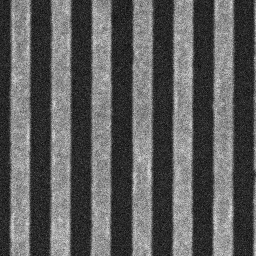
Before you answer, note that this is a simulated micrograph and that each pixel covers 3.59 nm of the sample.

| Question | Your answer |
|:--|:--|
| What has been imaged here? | parallel lines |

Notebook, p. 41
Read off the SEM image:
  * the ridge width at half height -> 0.0682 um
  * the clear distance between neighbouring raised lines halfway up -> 21.8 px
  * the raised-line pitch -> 0.146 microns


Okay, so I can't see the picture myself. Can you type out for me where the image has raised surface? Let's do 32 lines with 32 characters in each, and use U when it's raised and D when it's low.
DDUUDDDUUDDDUUDDDUUDDDUUDDDUUDDD
DUUUDDDUUDDDUUDDDUUDDDUUDDDUUDDD
DUUUDDDUUDDDUUDDDUUDDDUUDDDUUDDD
DUUUDDDUUDDDUUDDDUUDDDUUDDDUUDDD
DUUUDDDUUDDDUUDDDUUDDDUUDDDUUDDD
DDUUDDDUUDDDUUDDDUUDDDUUDDDUUDDD
DDUUDDDUUDDDUUDDDUUDDDUUDDDUUDDD
DDUUDDDUUDDDUUDDDUUDDDUUDDDUUDDD
DDUUDDDUUDDDUUDDDUUDDDUUDDDUUDDD
DUUUDDDUUDDDUUDDDUUDDDUUDDDUUDDD
DUUUDDDUUDDDUUDDDUUDDDUUDDDUUDDD
DUUUDDUUUDDDUUDDDUUDDDUUDDDUUDDD
DUUUDDUUUDDUUUDDDUUDDDUUDDDUUDDD
DUUUDDUUUDDDUUDDDUUDDDUUDDDUUDDD
DUUUDDUUUDDUUUDDDUUDDDUUDDDUUDDD
DUUUDDUUUDDDUUDDDUUDDDUUDDDUUDDD
DUUUDDUUUDDDUUDDDUUDDDUUDDDUUDDD
DUUUDDUUUDDDUUDDDUUDDDUUDDDUUDDD
DUUUDDUUUDDDUUDDDUUDDDUUDDDUUDDD
DUUUDDUUUDDUUUDDDUUDDDUUDDDUUDDD
DUUUDDUUUDDUUUDDDUUDDDUUDDDUUDDD
DUUUDDUUUDDDUUDDDUUDDDUUDDDUUDDD
DUUUDDUUUDDDUUDDDUUDDDUUDDDUUDDD
DUUUDDUUUDDDUUDDDUUDDDUUDDDUUDDD
DUUUDDUUUDDDUUDDDUUDDDUUDDDUUDDD
DUUUDDUUUDDDUUDDDUUDDDUUDDDUUDDD
DUUUDDUUUDDDUUDDDUUDDDUUDDDUUDDD
DUUUDDUUUDDDUUDDDUUDDDUUDDDUUDDD
DUUUDDUUUDDDUUDDDUUDDDUUDDDUUDDD
DUUUDDUUUDDDUUDDDUUDDDUUDDDUUDDD
DUUUDDUUUDDDUUDDDUUDDDUUDDDUUDDD
DUUUDDUUUDDUUUDDDUUDDDUUDDDUUDDD